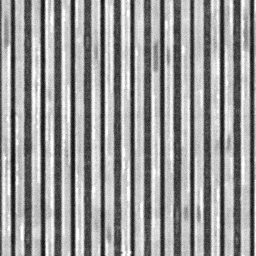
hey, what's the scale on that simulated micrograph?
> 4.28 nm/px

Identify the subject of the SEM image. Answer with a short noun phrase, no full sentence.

parallel lines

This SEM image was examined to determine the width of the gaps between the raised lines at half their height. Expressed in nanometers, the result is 25.7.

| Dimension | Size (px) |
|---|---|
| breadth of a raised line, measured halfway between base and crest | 7.87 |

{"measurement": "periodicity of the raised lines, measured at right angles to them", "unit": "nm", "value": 63.9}